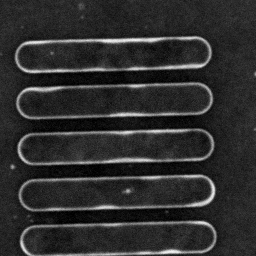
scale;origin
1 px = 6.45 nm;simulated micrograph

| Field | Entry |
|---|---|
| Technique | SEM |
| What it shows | groups of lines, slits or small figures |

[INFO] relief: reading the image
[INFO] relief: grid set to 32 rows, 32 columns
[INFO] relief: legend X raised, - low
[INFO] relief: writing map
--------------------------------
--------------------------------
--------------------------------
--------------------------------
--------------------------------
---XXXXXXXXXXXXXXXXXXXXXXX------
--XXXXXXXXXXXXXXXXXXXXXXXX------
--XXXXXXXXXXXXXXXXXXXXXXXX------
---XXXXXXXXXXXXXXXXXX-----------
--------------------------------
----------------------XXX-------
---XXXXXXXXXXXXXXXXXXXXXXX------
--XXXXXXXXXXXXXXXXXXXXXXXXX-----
--XXXXXXXXXXXXXXXXXXXXXXXX------
---XXXXXXXXXXX------------------
--------------------------------
----------------XXXXXXXXXX------
---XXXXXXXXXXXXXXXXXXXXXXXX-----
--XXXXXXXXXXXXXXXXXXXXXXXXX-----
---XXXXXXXXXXXXXXXXXXXXXXX------
----XXXX------------------------
--------------------------------
------XXXXXXXXXXXXXXXXXXXX------
---XXXXXXXXXXXXXXXXXXXXXXXX-----
--XXXXXXXXXXXXXXXXXXXXXXXXX-----
---XXXXXXXXXXXXXXXXXXXXXX-------
--------------------------------
--------------------------------
---XXXXXXXXXXXXXXXXXXXXXXXX-----
---XXXXXXXXXXXXXXXXXXXXXXXX-----
---XXXXXXXXXXXXXXXXXXXXXXXX-----
---XXXXXXXXXXXXXXXXXX-XXX-------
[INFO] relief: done